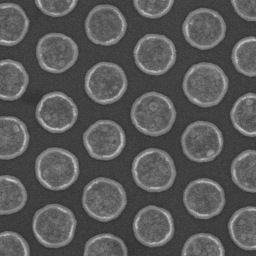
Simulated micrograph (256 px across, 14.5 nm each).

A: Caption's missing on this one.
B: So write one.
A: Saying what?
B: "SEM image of a regular array of raised bodies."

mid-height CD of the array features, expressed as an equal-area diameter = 0.571 microns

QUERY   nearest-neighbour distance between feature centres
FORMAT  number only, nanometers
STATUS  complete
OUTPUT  809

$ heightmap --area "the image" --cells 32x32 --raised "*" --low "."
.....****........****........***
***...**...****...***...***...**
***........****........*****....
***........*****.......*****....
***...**...****....*...*****....
.....****....*...****...***...**
.....*****.......*****.......***
.....****........*****.......***
***...**....***...***...***...**
***........****........*****....
***........*****.......*****....
***........****........*****....
.....****...**...****...***...**
.....****........*****.......***
.....****........*****.......***
***..****...**...****...**...***
***........****...**...****...**
***........*****.......*****....
***........****........*****....
**...****...**...****...***...**
.....*****.......****........***
.....*****.......*****.......***
**...****...*....*****...*...***
***...**...****...***..*****..**
***.......******.......*****....
***.......******.......*****....
*....****..****...***...***...**
....*****........****........***
....*****........*****.......***
**...****...**...****...**...***
***...**...****...**...*****..**
***........*****.......*****....